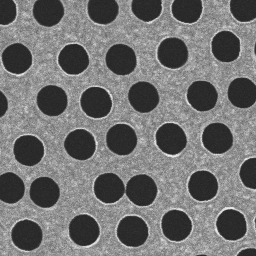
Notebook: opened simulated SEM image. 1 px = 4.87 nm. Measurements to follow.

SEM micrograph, a regular array of holes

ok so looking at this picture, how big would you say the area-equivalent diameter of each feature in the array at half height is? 150 nm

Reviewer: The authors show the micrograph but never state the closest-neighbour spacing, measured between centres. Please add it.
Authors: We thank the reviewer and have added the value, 218 nanometres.